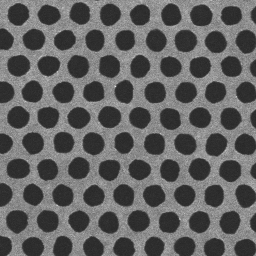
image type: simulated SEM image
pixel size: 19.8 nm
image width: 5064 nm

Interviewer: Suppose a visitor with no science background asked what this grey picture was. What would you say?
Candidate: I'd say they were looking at a regular array of holes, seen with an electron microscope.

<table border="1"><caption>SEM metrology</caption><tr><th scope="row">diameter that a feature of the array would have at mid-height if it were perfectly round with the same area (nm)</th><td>417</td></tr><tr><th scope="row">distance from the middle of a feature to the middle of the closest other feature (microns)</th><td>0.579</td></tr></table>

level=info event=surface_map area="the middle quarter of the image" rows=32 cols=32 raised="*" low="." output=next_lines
*.....***.....**......**.....**.
*.....***.....***....***.....***
**....***.....***....****...****
***.**************.*************
.******..*****..******.*********
..***.....***....****....***....
..***.....***....***.....***....
..***.....***....***.....***....
..***.....***....***.....***....
.*****..******..******..******.*
********************************
**....***.....***....****...****
*.....***.....**......**.....**.
*......*......**......**.....**.
*.....***.....***.....**.....***
**...*****...*****...****....***
**************************.*****
.*****...*****..*****...********
..***....****....***.....***....
..***.....***.....**.....**.....
..***.....***....***.....***....
..***.....***....****....***....
******...*************..******..
***.****************************
**....***....****...*****...****
*.....***.....**.....***.....**.
*.....**......**......**.....**.
*.....***.....***....***.....**.
***..*****...****....****...****
**************************.*****
*******.*****...*****...*****..*
..***....***.....***.....***....